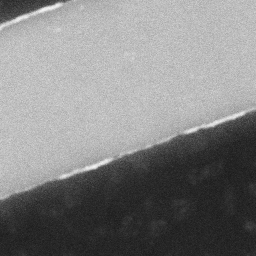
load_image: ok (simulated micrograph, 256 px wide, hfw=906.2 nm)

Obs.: one or a few lines or trenches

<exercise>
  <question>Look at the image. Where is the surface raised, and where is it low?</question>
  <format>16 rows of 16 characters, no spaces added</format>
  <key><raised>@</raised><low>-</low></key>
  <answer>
@@@-------------
@---------------
----------------
----------------
----------------
----------------
----------------
--------------@@
-----------@@@@@
--------@@@@@@@@
-----@@@@@@@@@@@
--@@@@@@@@@@@@@@
@@@@@@@@@@@@@@@@
@@@@@@@@@@@@@@@@
@@@@@@@@@@@@@@@@
@@@@@@@@@@@@@@@@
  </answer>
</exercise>